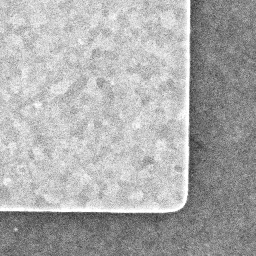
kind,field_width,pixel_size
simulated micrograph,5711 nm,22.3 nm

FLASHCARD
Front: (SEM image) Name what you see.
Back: wiring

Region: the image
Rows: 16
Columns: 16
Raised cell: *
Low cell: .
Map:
************....
************....
************....
************....
************....
************....
************....
************....
************....
************....
************....
************....
************....
................
................
................